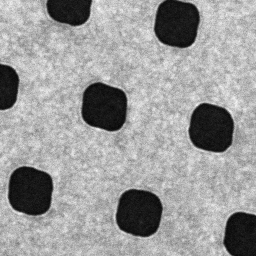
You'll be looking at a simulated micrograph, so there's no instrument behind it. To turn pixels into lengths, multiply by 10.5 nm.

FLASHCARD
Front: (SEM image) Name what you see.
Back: holes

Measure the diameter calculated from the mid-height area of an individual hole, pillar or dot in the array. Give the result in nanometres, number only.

512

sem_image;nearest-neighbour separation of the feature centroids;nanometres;1160